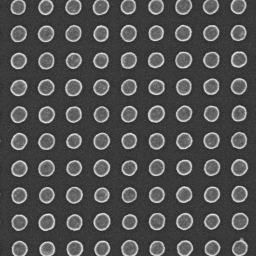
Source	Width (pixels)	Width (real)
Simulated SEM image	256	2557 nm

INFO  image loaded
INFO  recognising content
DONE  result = a regular array of raised bodies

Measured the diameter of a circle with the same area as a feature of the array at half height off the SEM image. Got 151 nm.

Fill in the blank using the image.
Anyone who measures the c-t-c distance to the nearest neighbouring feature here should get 267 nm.